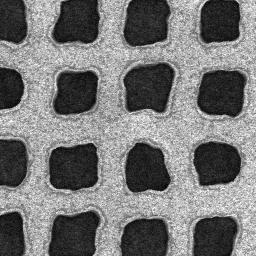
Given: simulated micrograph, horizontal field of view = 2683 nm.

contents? holes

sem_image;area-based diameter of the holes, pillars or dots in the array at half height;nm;513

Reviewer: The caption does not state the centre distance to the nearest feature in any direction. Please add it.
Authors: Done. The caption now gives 748 nm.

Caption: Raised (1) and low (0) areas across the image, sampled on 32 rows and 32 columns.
00011111000011110000011111000011
00011111000011110000011110000011
00011110000011110000011110000011
00001110000011110000011110000011
00011110000011110000011110000011
11111111111111110001111111111111
11111111111111111111111111111111
11111111111111111111111111111111
01111111111111111000001111111111
00011110000011110000001110000001
00011110000011100000001110000001
00011110000011110000011110000011
00011110000011110000011110000011
00111110000011110000011110000011
11111111111111111111111111110011
11111111111111111111111111111111
11111111111111111111111111111111
00111111111111111111111111111111
00011110000011111000111110000111
00001100000011110000111100000011
00001100000011110000011100000011
00011100000011110000011110000011
00011100000011110000011110000111
11111110000111110000011111111111
11111111111111111111111111111111
11111111111111111111111111111111
11111111111011111111111111111111
00011110000001111000111110000111
00011110000011110000011100000011
00011100000011100000011100000111
00011100000011100000011100000111
00011100000011100000011100000111